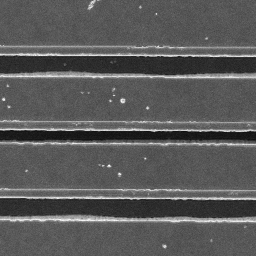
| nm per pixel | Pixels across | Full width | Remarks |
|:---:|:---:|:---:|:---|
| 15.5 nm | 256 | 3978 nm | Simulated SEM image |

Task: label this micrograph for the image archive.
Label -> lines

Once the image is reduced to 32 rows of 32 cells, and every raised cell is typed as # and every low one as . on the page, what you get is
################################
################################
################################
################################
################################
################################
################################
................................
................................
##################..............
################################
################################
################################
################################
################################
################################
................................
................................
################################
################################
################################
################################
################################
################################
################################
................................
................................
#########################.....#.
################################
################################
################################
################################